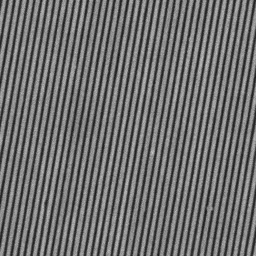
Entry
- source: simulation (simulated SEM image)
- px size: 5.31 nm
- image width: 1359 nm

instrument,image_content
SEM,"parallel lines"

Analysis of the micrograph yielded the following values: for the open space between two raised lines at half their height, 14.3 nm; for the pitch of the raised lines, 34.9 nm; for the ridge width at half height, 0.0197 micrometres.